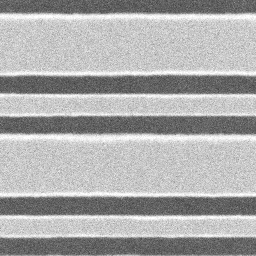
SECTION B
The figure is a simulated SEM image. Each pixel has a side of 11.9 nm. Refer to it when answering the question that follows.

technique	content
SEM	lines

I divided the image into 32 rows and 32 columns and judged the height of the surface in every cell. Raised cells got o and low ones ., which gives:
................................
................................
oooooooooooooooooooooooooooooooo
oooooooooooooooooooooooooooooooo
oooooooooooooooooooooooooooooooo
oooooooooooooooooooooooooooooooo
oooooooooooooooooooooooooooooooo
oooooooooooooooooooooooooooooooo
oooooooooooooooooooooooooooooooo
................................
................................
................................
oooooooooooooooooooooooooooooooo
oooooooooooooooooooooooooooooooo
................................
................................
................................
oooooooooooooooooooooooooooooooo
oooooooooooooooooooooooooooooooo
oooooooooooooooooooooooooooooooo
oooooooooooooooooooooooooooooooo
oooooooooooooooooooooooooooooooo
oooooooooooooooooooooooooooooooo
oooooooooooooooooooooooooooooooo
oooooooooooooooooooooooooooooooo
................................
................................
oooooooooooooooooooooooooooooooo
oooooooooooooooooooooooooooooooo
oooooooooooooooooooooooooooooooo
................................
................................